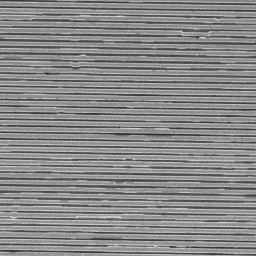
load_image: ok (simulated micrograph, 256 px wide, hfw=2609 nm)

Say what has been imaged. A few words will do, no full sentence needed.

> parallel lines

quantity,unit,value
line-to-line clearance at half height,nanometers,28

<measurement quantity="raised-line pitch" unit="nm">67.1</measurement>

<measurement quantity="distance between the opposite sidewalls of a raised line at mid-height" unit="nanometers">38.2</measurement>